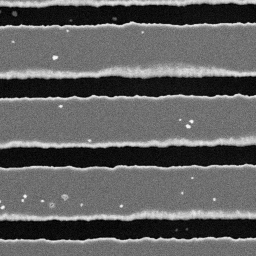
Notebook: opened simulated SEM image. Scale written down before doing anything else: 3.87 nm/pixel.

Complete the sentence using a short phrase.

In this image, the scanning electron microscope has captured lines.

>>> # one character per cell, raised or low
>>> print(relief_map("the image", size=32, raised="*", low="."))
************************.....**.
................................
................................
********************************
********************************
********************************
********************************
********************************
********************************
**************.*****************
................................
................................
********************************
********************************
********************************
********************************
********************************
********************************
................................
................................
................................
********************************
********************************
********************************
********************************
********************************
********************************
.*****..*..*...*................
................................
................................
********************************
********************************